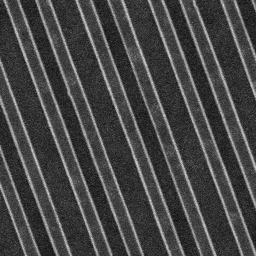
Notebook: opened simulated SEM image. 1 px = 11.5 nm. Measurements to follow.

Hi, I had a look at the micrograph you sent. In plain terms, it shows parallel lines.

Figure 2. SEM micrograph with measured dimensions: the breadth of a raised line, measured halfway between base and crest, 155 nm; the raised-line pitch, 388 nm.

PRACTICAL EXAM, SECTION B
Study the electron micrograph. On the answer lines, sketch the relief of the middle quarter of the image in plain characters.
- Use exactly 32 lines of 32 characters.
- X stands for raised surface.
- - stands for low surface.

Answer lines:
XX-------XXXX----XXXX------XXXX-
XXX-------XXX----XXXX-------XXX-
XXX-------XXX-----XXX-------XXX-
XXXX------XXXX----XXXX------XXXX
XXXX-------XXX----XXXX-------XXX
-XXX-------XXXX----XXXX------XXX
-XXXX------XXXX----XXXX------XXX
-XXXX-------XXX----XXXX-------XX
--XXX-------XXXX----XXXX------XX
--XXXX------XXXX----XXXX------XX
---XXX-------XXX-----XXX-------X
---XXXX------XXXX----XXXX------X
---XXXX-------XXX----XXXX-------
----XXX-------XXXX----XXX-------
----XXXX------XXXX----XXXX------
----XXXX-------XXX-----XXX------
-----XXX-------XXXX----XXXX-----
X----XXXX------XXXX----XXXX-----
X-----XXX-------XXX-----XXX-----
XX----XXX-------XXXX----XXXX----
XX----XXXX-------XXX----XXXX----
XX-----XXX-------XXX-----XXX----
XXX----XXXX------XXXX----XXXX---
XXX----XXXX-------XXX----XXXX---
XXX-----XXX-------XXXX----XXX---
XXXX----XXXX------XXXX----XXXX--
-XXX----XXXX-------XXX----XXXX--
-XXX-----XXX-------XXXX----XXXX-
-XXXX----XXXX------XXXX----XXXX-
--XXX-----XXX-------XXX----XXXX-
--XXXX----XXX-------XXXX----XXXX
--XXXX----XXXX-------XXX----XXXX